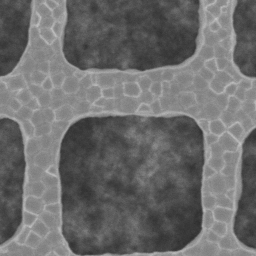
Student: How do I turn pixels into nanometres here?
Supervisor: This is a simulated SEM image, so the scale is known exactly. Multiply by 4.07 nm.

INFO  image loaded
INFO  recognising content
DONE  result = holes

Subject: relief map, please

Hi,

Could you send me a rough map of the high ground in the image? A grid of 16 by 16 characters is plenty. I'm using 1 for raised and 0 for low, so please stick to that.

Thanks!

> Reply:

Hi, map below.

0011000000000110
0011000000000110
0011000000001110
0111000000001110
0111111111111110
1111111111111111
1111111111111111
0111100000001111
0111000000000110
0011000000000110
0011000000000110
0111000000000110
0111000000000110
0111000000000110
0111000000001110
1111000000001110